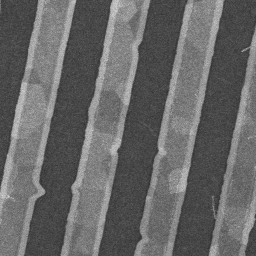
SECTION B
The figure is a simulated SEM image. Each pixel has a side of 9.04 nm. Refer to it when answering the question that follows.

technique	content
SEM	one or a few lines or trenches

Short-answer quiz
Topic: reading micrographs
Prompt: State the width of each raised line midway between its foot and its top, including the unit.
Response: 272 nm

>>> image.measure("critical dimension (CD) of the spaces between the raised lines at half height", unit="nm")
384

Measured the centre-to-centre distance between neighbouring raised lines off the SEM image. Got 655 nm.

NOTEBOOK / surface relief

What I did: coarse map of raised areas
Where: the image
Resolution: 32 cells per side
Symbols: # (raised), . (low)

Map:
.....####.....####......####....
.....####.....####.....####.....
.....####.....####.....####.....
.....###......####.....####.....
....####......###......####.....
....####.....####......###......
....####.....####.....####......
....####.....####.....####.....#
....###......####.....####.....#
...####......###......####.....#
...####.....####......###......#
...####.....####.....####......#
...####.....####.....####.....##
..####......####.....####.....##
..####.....####......####.....##
..####.....####......###......##
..####.....####.....####......##
..####.....####.....####.....###
..###......###......####.....###
.####......###......####.....###
.####.....####......###......###
.####.....####.....####......###
.####.....####.....####.....####
#####....#####.....####.....####
#####....####......####.....####
####.....####.....####......####
####.....####.....####......####
###......####.....####.....####.
###......####.....####.....####.
###......###......###......####.
###.....####......###......####.
###.....####.....####......###..